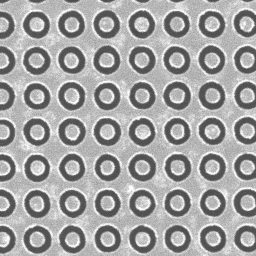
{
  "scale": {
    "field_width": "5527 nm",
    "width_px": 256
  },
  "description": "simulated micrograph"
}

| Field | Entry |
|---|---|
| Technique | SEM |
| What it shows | a regular array of ring-shaped grooves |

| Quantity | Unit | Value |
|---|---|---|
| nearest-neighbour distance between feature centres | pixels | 34.8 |